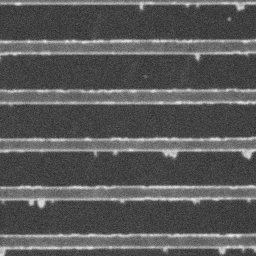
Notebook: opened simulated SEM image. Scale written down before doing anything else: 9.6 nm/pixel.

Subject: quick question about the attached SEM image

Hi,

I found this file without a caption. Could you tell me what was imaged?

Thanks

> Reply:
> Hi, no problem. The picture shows lines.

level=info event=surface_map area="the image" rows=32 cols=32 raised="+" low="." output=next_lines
................................
................................
................................
................................
................................
++++++++++++++++++++++++++++++++
++++++++++++++++++++++++++++++++
................................
................................
................................
................................
++++++++++++++++++++++++++++++++
++++++++++++++++++++++++++++++++
................................
................................
................................
................................
++++++++++++++++++++++++++++++++
++++++++++++++++++++++++++++++++
................................
................................
................................
................................
++++++++++++++++++++++++++++++++
++++++++++++++++++++++++++++++++
................................
................................
................................
................................
++++++++++++++++++++++++++++++++
++++++++++++++++++++++++++++++++
................................